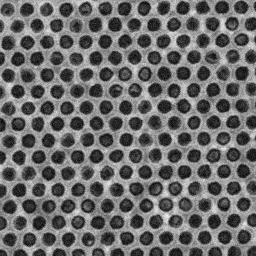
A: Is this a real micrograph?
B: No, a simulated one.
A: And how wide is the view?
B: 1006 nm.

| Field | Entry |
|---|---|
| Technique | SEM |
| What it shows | a regular array of holes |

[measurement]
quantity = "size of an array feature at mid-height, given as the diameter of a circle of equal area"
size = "59.7 nanometres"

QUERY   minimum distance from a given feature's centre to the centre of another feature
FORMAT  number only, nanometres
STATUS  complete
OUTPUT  73.5